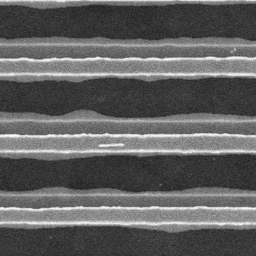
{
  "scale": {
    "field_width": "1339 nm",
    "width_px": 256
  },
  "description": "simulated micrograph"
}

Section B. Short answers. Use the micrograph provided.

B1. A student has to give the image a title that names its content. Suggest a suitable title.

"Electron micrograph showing lines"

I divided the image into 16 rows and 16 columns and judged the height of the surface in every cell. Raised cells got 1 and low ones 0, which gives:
0000000000000000
0000000000000000
0000000000000000
1111111111111111
1111111111111111
0000000000000000
0000000000000000
1111111000011110
1111111111111111
1111111111111101
0000000000000000
0000000000000000
1111111111111111
1111111111111111
0000000000000000
0000000000000000